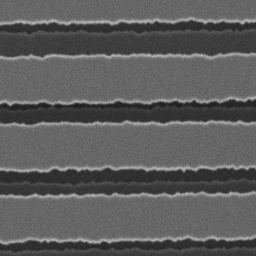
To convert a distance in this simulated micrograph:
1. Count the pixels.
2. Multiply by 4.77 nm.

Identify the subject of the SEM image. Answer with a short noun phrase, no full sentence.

lines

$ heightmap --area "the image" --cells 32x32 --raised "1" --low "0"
11111111111111111111111111111111
11111111111111111111111111111111
11111111111111111111111111111111
00000000000000000000000000000000
00000000000000000000000000000000
00000000000000000000000000000000
00000000000000000000000000000000
11111111111111111111111111111111
11111111111111111111111111111111
11111111111111111111111111111111
11111111111111111111111111111111
11111111111111111111111111111111
11111111111111111111111111111111
00000000000000000000000000000000
00000000000000000000000000000000
01000111111111111111111111111111
11111111111111111111111111111111
11111111111111111111111111111111
11111111111111111111111111111111
11111111111111111111111111111111
11111111111111111111111111111111
00110100000000000000000000000000
00000000000000000000000000000000
00000000000000000000000000000000
11101111111111111111111111111111
11111111111111111111111111111111
11111111111111111111111111111111
11111111111111111111111111111111
11111111111111111111111111111111
11111111111111111111111111111111
10000000000000000000000000000000
00000000000000000000000000000000